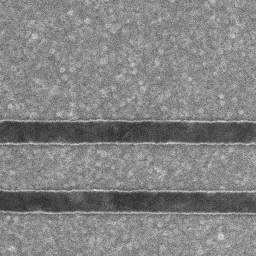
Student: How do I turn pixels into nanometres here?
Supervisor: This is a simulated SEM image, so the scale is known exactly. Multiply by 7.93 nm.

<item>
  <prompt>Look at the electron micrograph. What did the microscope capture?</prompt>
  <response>one or a few lines or trenches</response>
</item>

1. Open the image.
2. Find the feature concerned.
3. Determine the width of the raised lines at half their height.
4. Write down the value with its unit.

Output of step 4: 185 nanometers